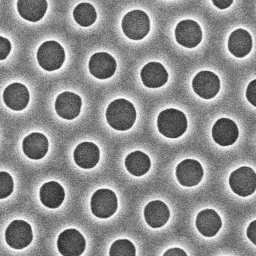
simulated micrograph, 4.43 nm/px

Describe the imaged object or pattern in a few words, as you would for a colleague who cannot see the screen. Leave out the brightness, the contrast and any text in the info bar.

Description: a regular array of holes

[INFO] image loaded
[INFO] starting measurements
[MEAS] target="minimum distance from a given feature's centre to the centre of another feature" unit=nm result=230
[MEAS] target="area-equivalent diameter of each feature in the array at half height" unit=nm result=125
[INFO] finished